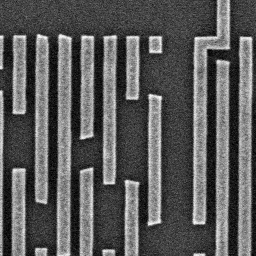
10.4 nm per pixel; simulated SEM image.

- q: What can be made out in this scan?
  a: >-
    wiring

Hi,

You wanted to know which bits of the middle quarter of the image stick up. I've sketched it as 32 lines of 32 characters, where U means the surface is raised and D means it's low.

UUDDUUUDDDUUUDDDUUUDDDDDDDDDDDDD
UUDDUUUDDDUUUDDDUUUDDDDDDDDDDDDD
UUDDDUUDDDUUUDDDUUUDDDDDDDDDDDDD
UUDDDUUDDDUUUDDDUUUDDDDDDDDDDDDD
UUDDDUUDDDUUUDDDUUUDDDDDDDDDDDDD
UUDDUUUDDDUUUDDDUUUDDDDDDDDDDDDD
UUDDUUUDDDUUUDDDUUUDDDDDDDDDDDDD
UUDDUUUDDDUUUDDDUUDDDDDDDDDDDDDD
UUDDUUUDDDUUUDDDUUDDDUUUDDDDDDDD
UUDDUUUDDDUUUDDDDDDDDDUUDDDDDDDD
UUDDUUUDDDUUUDDDDDDDDDUUDDDDDDDD
UUDDUUUDDDUUUDDDDDDDDDUUDDDDDDDD
UDDDUUUDDDUUUDDDDDDDDUUUDDDDDDDD
UDDDUUUDDDUUUDDDDDDDDUUUDDDDDDDD
UDDDUUUDDDUUUDDDDDDDDUUUDDDDDDDD
UDDDUUUDDDUUUDDDDDDDDUUUDDDDDDDD
UDDDUUUDDDUUUDDDDDDDDUUUDDDDDDDD
UUDDUUUDDDUUUDDDDDDDDUUUDDDDDDDD
UUDDUDDDDDUUUDDDDDDDDUUUDDDDDDDD
UUDDDDDDDDUUUDDDDDDDDUUUDDDDDDDD
UDDDDDDDDDUUUDDDDDDDDUUUDDDDDDDD
UDDDDDDDDDUUUDDDDDDDDUUUDDDDDDDD
UDDDDDDDDDUUUDDDDDDDDUUUDDDDDDDD
UDDDDDDDDDUUUDDDDDDDDUUUDDDDDDDD
UDDDDDDDDDUUUDDDDDDDDUUUDDDDDDDD
UDDDDDDDDDUUUDDDDDDDDUUUDDDDDDDD
UDDDDUUDDDUUUDDDDDDDDUUUDDDDDDDD
UDDDUUUDDDUUUDDDDDDDDUUUDDDDDDDD
UDDDUUUDDDUUUDDDDDDDDUUUDDDDDDDD
UDDDUUUDDDUUDDDUUUDDDUUUDDDDDDDD
UDDDUUUDDDDDDDDUUUUDDUUUDDDDDDDD
UDDDUUUDDDDDDDDDUUDDDUUUDDDDDDDD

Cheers